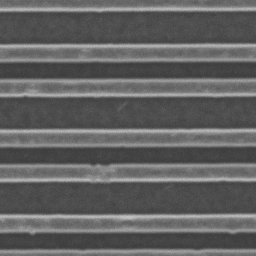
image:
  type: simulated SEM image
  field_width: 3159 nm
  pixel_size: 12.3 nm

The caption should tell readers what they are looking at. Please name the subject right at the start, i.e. parallel lines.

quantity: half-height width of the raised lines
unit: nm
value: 187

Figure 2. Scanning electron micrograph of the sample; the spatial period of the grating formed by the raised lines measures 526 nm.